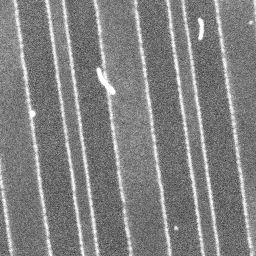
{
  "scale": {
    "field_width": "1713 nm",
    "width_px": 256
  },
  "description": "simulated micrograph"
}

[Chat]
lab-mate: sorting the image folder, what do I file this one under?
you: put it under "lines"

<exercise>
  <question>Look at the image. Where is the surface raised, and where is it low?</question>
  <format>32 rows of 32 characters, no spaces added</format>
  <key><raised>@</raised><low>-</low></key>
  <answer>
@@----@@----@@@@@----@@----@@@@@
@@----@@----@@@@@----@@----@@@@@
@@----@@----@@@@@----@@----@@@@@
@@----@@----@@@@@----@@----@@@@@
@@@---@@@----@@@@@----@@----@@@@
@@@----@@----@@@@@----@@----@@@@
@@@----@@----@@@@@----@@----@@@@
@@@----@@----@@@@@----@@----@@@@
@@@----@@----@@@@@----@@----@@@@
@@@----@@----@@@@@----@@----@@@@
@@@----@@----@@@@@----@@----@@@@
@@@----@@----@@@@@----@@@----@@@
@@@@----@@----@@@@@----@@----@@@
@@@@----@@----@@@@@----@@----@@@
@@@@----@@----@@@@@----@@----@@@
@@@@----@@----@@@@@----@@----@@@
@@@@----@@----@@@@@----@@----@@@
@@@@----@@----@@@@@----@@----@@@
@@@@----@@----@@@@@----@@-----@@
@@@@@----@@----@@@@@----@@----@@
@@@@@----@@----@@@@@----@@----@@
@@@@@----@@----@@@@@----@@----@@
@@@@@----@@----@@@@@----@@----@@
@@@@@----@@----@@@@@----@@----@@
@@@@@----@@----@@@@@----@@----@@
-@@@@----@@----@@@@@----@@----@@
-@@@@@----@@---@@@@@@----@@----@
-@@@@@----@@----@@@@@----@@----@
-@@@@@----@@----@@@@@----@@----@
-@@@@@----@@----@@@@@----@@----@
-@@@@@----@@----@@@@@----@@----@
-@@@@@----@@----@@@@@----@@----@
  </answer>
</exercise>